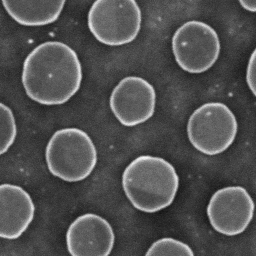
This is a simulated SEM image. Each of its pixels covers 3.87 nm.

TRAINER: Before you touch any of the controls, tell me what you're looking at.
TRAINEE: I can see raised bodies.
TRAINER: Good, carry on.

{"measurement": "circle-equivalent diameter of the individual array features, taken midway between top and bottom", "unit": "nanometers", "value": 191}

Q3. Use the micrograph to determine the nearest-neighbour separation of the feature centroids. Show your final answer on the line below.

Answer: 0.32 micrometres